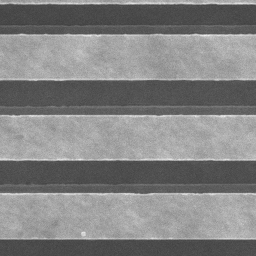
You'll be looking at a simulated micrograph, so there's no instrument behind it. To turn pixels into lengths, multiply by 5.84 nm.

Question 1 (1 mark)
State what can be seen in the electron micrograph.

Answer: lines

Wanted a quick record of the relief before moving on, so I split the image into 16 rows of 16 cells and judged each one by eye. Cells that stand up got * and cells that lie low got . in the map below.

................
................
****************
****************
****************
................
................
****************
****************
****************
................
................
****************
****************
****************
................